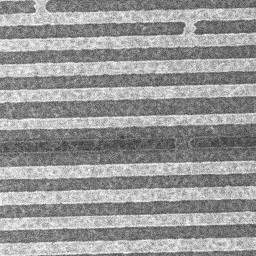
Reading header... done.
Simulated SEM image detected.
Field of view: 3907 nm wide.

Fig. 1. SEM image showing parallel lines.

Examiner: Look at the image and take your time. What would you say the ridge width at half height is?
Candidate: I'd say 181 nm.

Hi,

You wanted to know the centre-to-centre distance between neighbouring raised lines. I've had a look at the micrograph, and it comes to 390 nm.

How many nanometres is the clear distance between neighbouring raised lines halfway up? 210